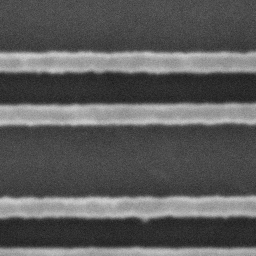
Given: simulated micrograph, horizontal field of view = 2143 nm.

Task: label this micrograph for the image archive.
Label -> lines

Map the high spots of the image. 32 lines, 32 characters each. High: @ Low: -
--------------------------------
--------------------------------
--------------------------------
--------------------------------
--------------------------------
--------------------------------
--------------------------------
@@@@@@@@@@@@@@@@@@@@@@@@@@@@@@@@
@@@@@@@@@@@@@@@@@@@@@@@@@@@@@@@@
--------------------------------
--------------------------------
--------------------------------
--------------------------------
@@@@@@@@@@@@@@@@@@@@@@@@@@@@@@@@
@@@@@@@@@@@@@@@@@@@@@@@@@@@@@@@@
@@@@@@@@@@@@@@--@--------------@
--------------------------------
--------------------------------
--------------------------------
--------------------------------
--------------------------------
--------------------------------
--------------------------------
--------------------------------
--------------------------------
@@@@@@@@@@@@@@@@@@@@@@@@@@@@@@@@
@@@@@@@@@@@@@@@@@@@@@@@@@@@@@@@@
--------------------------------
--------------------------------
--------------------------------
--------------------------------
@@@@@@@@@@@@@@@@@@@@@@@@@@@@@@@@